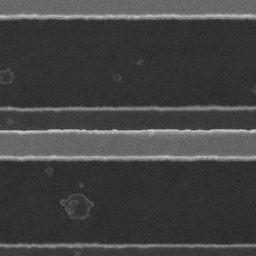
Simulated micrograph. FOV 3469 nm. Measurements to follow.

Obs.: lines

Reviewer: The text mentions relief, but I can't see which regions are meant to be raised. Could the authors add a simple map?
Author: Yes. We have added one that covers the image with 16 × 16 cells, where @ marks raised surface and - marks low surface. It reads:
@@@@@@@@@@@@@@@@
----------------
----------------
----------------
----------------
----------------
----------------
@@@@@@@@@@@@@@@@
@@@@@@@@@@@@@@@@
@@@@@@@@@@@@@@@@
----------------
----------------
----------------
----------------
----------------
@@@@@@@@@@@@@@@@